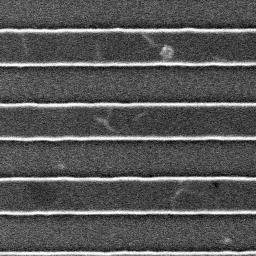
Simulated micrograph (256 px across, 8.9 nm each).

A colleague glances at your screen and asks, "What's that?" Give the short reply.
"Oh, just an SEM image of wiring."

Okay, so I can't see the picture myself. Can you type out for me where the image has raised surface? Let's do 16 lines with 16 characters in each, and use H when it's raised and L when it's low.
LLLLLLLLLLLLLLLL
LLLLLLLLLLLLLLLL
HHHHHHHHHHHHHHHH
HHHHHHHHHHHHHHHH
LLLLLLLLLLLLLLLL
LLLLLLLLLLLLLLLL
LLLLLLLLLLLLLLLL
HHHHHHHHHHHHHHHH
HHHHHHHHHHHHHHHH
LLLLLLLLLLLLLLLL
LLLLLLLLLLLLLLLL
HHHHHHHHHHHHHHHH
HHHHHHHHHHHHHHHH
LLLLLLLLLLLLLLLL
LLLLLLLLLLLLLLLL
LLLLLLLLLLLLLLLL